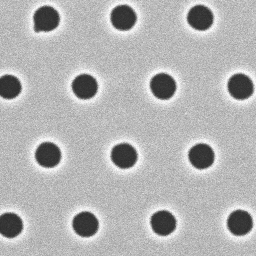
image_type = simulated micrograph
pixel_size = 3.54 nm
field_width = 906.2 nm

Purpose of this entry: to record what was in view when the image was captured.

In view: a regular array of holes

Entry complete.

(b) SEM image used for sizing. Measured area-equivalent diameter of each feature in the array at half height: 0.0944 µm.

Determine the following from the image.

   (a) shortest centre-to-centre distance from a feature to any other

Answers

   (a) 272 nanometers